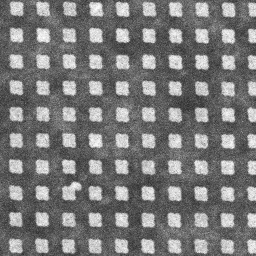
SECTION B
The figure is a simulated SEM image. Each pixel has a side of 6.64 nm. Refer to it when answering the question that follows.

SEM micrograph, a regular array of raised bodies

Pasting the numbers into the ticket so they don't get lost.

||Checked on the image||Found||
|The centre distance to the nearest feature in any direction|173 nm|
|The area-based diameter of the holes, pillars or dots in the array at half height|92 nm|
